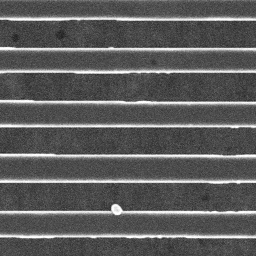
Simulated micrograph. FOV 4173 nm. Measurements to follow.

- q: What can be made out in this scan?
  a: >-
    lines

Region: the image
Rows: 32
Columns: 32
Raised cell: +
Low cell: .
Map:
++++++++++++++++++++++++++++++++
++++++++++++++++++++++++++++++++
................................
................................
................................
................................
++++++++++++++++++++++++++++++++
++++++++++++++++++++++++++++++++
++++++++++++++++++++++++++++++++
................................
................................
................................
................................
++++++++++++++++++++++++++++++++
++++++++++++++++++++++++++++++++
++++++++++++++++++++++++++++++++
................................
................................
................................
+++++++++++++++++++++++++++...++
++++++++++++++++++++++++++++++++
++++++++++++++++++++++++++++++++
++++++++++++++++++++++++++++++++
................................
................................
................................
+++++++++++++++++++++++++.+...++
++++++++++++++++++++++++++++++++
++++++++++++++++++++++++++++++++
++++++++++++++++++++++++++++++++
................................
................................